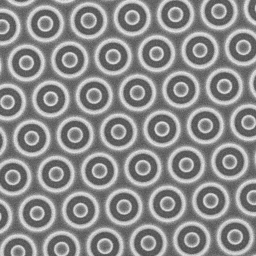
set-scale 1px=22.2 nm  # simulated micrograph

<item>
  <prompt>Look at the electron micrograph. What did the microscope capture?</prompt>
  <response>an array of small figures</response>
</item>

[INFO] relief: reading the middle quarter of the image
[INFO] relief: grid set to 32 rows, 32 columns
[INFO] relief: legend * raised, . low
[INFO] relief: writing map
**...****.......*****.....******
.....*****.....*****************
....************************..**
*****************...******......
******....*****......*****......
****.......****.......***...***.
****..**...***...***..***...***.
.***..***...**...***..***...***.
.**...***...***..***..****......
.***...*...****.......*****.....
****.......*****.....***********
******...***********************
***********************...******
***********.....*****.......****
.....*****.......****.......***.
......****...**..***...***...**.
..**...***..***...**...***...**.
.***...***..***...***..**...****
.***...***...*...****.......****
..*...*****......*****.....*****
......******....****************
*...*************************...
******************....******....
*******....******......****.....
.*****......****...**..****..***
.****...**...***..***...**...***
..***..***...***..***...***...**
..***..***...***...**...***.....
..***........****......*****....
..****......******....**********
.******....*********************
************************....****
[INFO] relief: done